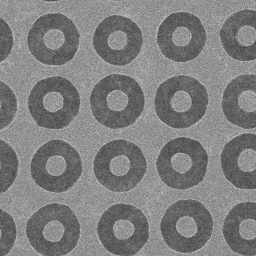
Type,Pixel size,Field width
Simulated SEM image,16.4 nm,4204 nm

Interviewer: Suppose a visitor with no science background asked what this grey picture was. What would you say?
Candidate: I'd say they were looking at a regular array of ring-shaped grooves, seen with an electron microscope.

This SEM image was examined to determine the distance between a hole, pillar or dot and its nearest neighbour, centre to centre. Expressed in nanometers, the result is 1030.